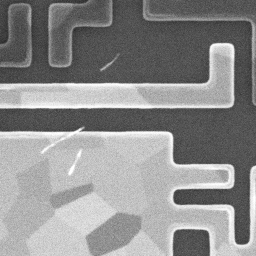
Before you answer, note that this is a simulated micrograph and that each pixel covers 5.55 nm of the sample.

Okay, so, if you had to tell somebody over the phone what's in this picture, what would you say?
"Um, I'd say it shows wiring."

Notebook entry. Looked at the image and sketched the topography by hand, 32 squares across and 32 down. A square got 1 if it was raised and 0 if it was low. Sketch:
00100001101111000011111111111111
01110011111111000011111111111111
01110011111111000011111111111111
01110011100000000000000000000000
01110011100000000000000000000000
11110011100000000000000000011000
11110011100000000000000000111000
11110011100000000000000000111000
00000000000000000000000000111000
00000000000000000000000000111000
00000011110001100000000001111000
11111111111111111111111111111000
11111111111111111111111111111000
00000000000000000000000000000000
00000000000000000000000000000000
00000000000000000000000000000000
00000000010000000000000000000000
11111111111111111111110000000000
11111111111111111111110000000000
11111111111111111111110000000000
11111111111111111111110000000000
11111111111111111111111111111001
11111111111111111111111111111001
11111111111111111111111111111001
11111111111111111111110000000001
11111111111111111111110000000001
11111111111111111111111111111001
11111111111111111111111111111001
11111111111111111111111111111001
11111111111111111111110000111001
11111111111111111111110000111101
11111111111111111111110000111111